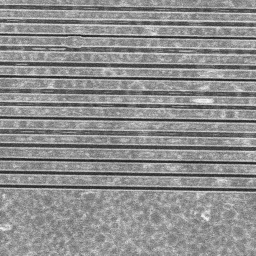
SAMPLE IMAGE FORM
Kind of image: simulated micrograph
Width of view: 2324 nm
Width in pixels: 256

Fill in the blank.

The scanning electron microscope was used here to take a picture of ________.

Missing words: parallel lines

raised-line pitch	125	nanometers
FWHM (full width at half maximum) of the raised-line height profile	86.3	nm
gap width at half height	43.1	nanometres